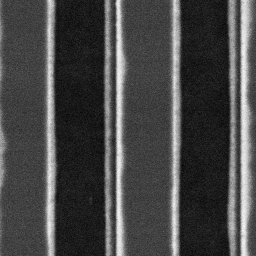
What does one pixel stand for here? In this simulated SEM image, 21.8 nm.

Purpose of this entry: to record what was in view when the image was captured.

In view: lines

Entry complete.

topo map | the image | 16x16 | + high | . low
+++....++++....+
+++....++++....+
+++....++++....+
+++....++++....+
+++....++++....+
+++....++++....+
+++....++++....+
+++....++++....+
+++....++++....+
+++....++++....+
+++....++++....+
+++....++++....+
+++....++++....+
+++....++++....+
+++....++++....+
+++....++++....+